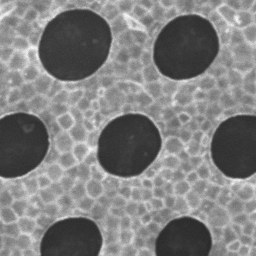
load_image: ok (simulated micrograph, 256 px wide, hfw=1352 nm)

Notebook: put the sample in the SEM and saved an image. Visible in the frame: holes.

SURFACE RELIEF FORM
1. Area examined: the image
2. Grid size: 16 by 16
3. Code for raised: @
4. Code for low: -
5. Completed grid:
@@@@@@@@@@@@@@@@
@@@----@@@---@@@
@@@----@@@----@@
@@-----@@@---@@@
@@@---@@@@---@@@
@@@@@@@@@@@@@@@@
@@@@@@@@@@@@@@@@
--@@@@@--@@@@@--
---@@@----@@@---
---@@@----@@@---
--@@@@---@@@@@--
@@@@@@@@@@@@@@@@
@@@@@@@@@@@@@@@@
@@@@@@@@@@@@@@@@
@@@---@@@@---@@@
@@@---@@@@---@@@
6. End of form